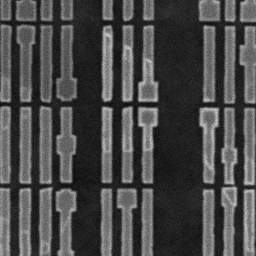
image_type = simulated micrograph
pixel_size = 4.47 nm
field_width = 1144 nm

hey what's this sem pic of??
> wiring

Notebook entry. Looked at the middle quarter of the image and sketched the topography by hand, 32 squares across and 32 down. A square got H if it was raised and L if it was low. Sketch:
HHLLLLLLLLHHLLLHHLLLLLLLLLLLLLLL
HHLLLLLLLLHHLLLHHLLLLLLLLLLLLLLL
HHLLLLLLLLHHLLLHHLLLHHLLLLLLLLLL
HHLLLLLLLLHHLLLHHLLLHHLLLLLLLLLL
HHHLLLLLLLHHLLLHHLLHHHHLLLLLLLLL
HHHLLLLLLLHHLLLHHLLHHHHLLLLLLLLL
HHHLLLLLLLHHLLLHHLLHHHHLLLLLLLLL
HHHLLLLLLLHHLLLHHLLHHHHLLLLLLLLL
HHLLLLLLLLHHLLLHHLLHHHHLLLLLLLLL
LLLLLLLLLLLLLLLLLLLLLLLLLLLLLLLL
LLLLLLLLLLLLLLLLLLLLLLLLLLLLLLLL
HHLLLLLLLLHHLLLHHLLHHHHLLLLLLLLL
HHLLLLLLLLHHLLLHHLLHHHHLLLLLLLLL
HHLLLLLLLLHHLLLHHLLHHHHLLLLLLLLL
HHLLLLLLLLHHLLLHHLLHHHHLLLLLLLLL
HHLLLLLLLLHHLLLHHLLHHHLLLLLLLLLL
HHLLLLLLLLHHLLLHHLLLHHLLLLLLLLLL
HHLLLLLLLLHHLLLHHLLLHHLLLLLLLLLL
HHHLLLLLLLHHLLLHHLLLHHLLLLLLLLLL
HHHLLLLLLLLHLLLLHLLLLLLLLLLLLLLL
HHHLLLLLLLLHLLLLHLLLLLLLLLLLLLLL
HHHLLLLLLLLHLLLLHLLLHHLLLLLLLLLL
HHLLLLLLLLHHLLLHHLLLHHLLLLLLLLLL
HHLLLLLLLLHHLLLHHLLLHHLLLLLLLLLL
HHLLLLLLLLHHLLLHHLLLHHLLLLLLLLLL
HHLLLLLLLLHHLLLHHLLLHHLLLLLLLLLL
HHLLLLLLLLHHLLLHHLLLHHLLLLLLLLLL
HHLLLLLLLLHHLLLHHLLLHHLLLLLLLLLL
HHLLLLLLLLHHLLLHHLLLHHLLLLLLLLLL
LLLLLLLLLLLLLLLLLLLLHHLLLLLLLLLL
LLLLLLLLLLLLLLLLLLLLLLLLLLLLLLLL
HHLLLLLLLLHHLLHHHHLLHHLLLLLLLLLL